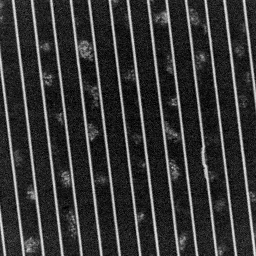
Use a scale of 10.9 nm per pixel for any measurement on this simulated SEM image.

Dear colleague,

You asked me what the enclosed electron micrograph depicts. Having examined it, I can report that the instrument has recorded parallel lines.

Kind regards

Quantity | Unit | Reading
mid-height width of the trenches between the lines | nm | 216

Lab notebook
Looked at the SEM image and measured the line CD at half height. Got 206 nanometers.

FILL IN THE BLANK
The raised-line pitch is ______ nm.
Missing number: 418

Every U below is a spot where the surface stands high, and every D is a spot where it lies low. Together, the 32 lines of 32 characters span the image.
UUDDUUDDDUUDDDUUDDDUUDDUUUDDUUUD
UUDDUUUDDUUDDDUUDDDUUDDUUUDDUUUD
UUDDUUUDDUUDDDUUDDDUUDDDUUDDUUUD
UUDDUUUDDUUUDDUUDDDUUDDDUUDDUUUD
UUDDDUUDDUUUDDUUUDDUUDDDUUDDDUUD
UUDDDUUDDDUUDDUUUDDUUDDDUUDDDUUD
UUDDDUUDDDUUDDDUUDDUUUDDUUDDDUUD
UUUDDUUDDDUUDDDUUDDUUUDDUUUDDUUD
UUUDDUUDDDUUDDDUUDDDUUDDUUUDDUUU
UUUDDUUUDDUUDDDUUDDDUUDDUUUDDUUU
UUUDDUUUDDUUDDDUUDDDUUDDDUUDDUUU
DUUDDUUUDDUUUDDUUDDDUUDDDUUDDUUU
DUUDDDUUDDUUUDDUUDDDUUDDDUUDDDUU
DUUDDDUUDDUUUDDUUUDDUUDDDUUDDDUU
DUUDDDUUDDDUUDDUUUDDUUUDDUUDDDUU
DUUDDDUUDDDUUDDDUUDDUUUDDUUDDDUU
DUUUDDUUDDDUUDDDUUDDUUUDDUUUDDUU
DUUUDDUUDDDUUDDDUUDDDUUDDUUUDDUU
DUUUDDUUUDDUUDDDUUDDDUUDDUUUDDUU
DUUUDDUUUDDUUDDDUUDDDUUDDUUUDDUU
DDUUDDUUUDDUUUDDUUDDDUUDDDUUDDUU
DDUUDDDUUDDUUUDDUUUDDUUDDDUUDDDU
DDUUDDDUUDDDUUDDUUUDDUUDDDUUDDDU
DDUUDDDUUDDDUUDDDUUDDUUUDDUUDDDU
DDUUUDDUUDDDUUDDDUUDDUUUDDUUUDDU
DDUUUDDUUDDDUUDDDUUDDDUUDDUUUDDU
DDUUUDDUUUDDUUDDDUUDDDUUDDUUUDDU
DDUUUDDUUUDDUUDDDUUDDDUUDDDUUDDU
DDDUUDDUUUDDUUUDDUUDDDUUDDDUUDDU
DDDUUDDDUUDDUUUDDUUUDDUUDDDUUDDD
DDDUUDDDUUDDDUUDDUUUDDUUDDDUUDDD
UDDUUDDDUUDDDUUDDDUUDDUUUDDUUDDD